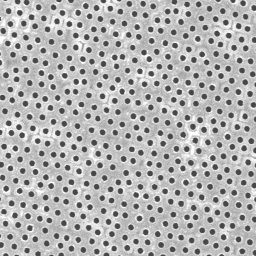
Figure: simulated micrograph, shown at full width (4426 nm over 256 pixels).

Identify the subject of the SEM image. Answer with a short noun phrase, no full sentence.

a regular array of holes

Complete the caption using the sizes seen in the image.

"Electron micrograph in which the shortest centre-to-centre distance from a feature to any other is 183 nanometers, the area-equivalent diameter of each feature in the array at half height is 6.18 px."